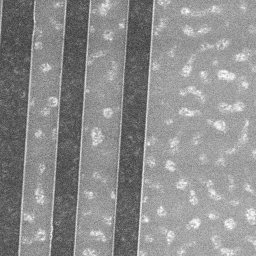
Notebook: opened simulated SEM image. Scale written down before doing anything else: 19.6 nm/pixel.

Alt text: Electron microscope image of one or a few lines or trenches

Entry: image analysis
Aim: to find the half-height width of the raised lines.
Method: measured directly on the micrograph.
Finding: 25.7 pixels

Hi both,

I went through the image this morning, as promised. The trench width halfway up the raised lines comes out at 678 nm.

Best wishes